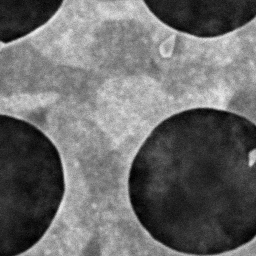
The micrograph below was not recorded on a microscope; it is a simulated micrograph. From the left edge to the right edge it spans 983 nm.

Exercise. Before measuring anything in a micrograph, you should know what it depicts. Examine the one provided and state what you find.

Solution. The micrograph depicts holes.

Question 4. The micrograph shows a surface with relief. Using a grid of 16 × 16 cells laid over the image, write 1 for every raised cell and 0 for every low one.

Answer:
0000111110000000
0001111111000001
0111111111111111
1111111111111111
1111111111111111
1111111111111111
1111111111111111
0111111111000000
0001111110000000
0000111110000000
0000111100000000
0000111100000000
0000111100000000
0001111100000000
0001111110000000
0011111111100001